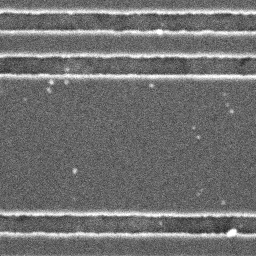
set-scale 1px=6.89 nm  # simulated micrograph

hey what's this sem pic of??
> lines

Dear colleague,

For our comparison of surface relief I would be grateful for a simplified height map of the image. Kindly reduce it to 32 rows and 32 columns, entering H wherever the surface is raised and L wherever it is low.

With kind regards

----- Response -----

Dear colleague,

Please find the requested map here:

HHHHHHHHHHHHHHHHHHHHHHHHHHHHHHHH
HHHHHHHHHHHHHHHHHHHHHHHHHHHHHHHH
LLLLLLLLLLLLLLLLLLLLLLLLLLLLLLLL
LLLLLLLLLLLLLLLLLLLLLLLLLLLLLLLL
HHHHHHHHHHHHHHHHHHHHHHHHHHHHHHHH
HHHHHHHHHHHHHHHHHHHHHHHHHHHHHHHH
HHHHHHHHHHHHHHHHHHHHHHHHHHHHHHHH
LLLLLLLLLLLLLLLLLLLLLLLLLLLLLLLL
LLLLLLLLLLLLLLLLLLLLLLLLLLLLLLLL
HHHHHHHHHHHHHHHHHHHHHHHHHHHHHHHH
HHHHHHHHHHHHHHHHHHHHHHHHHHHHHHHH
HHHHHHHHHHHHHHHHHHHHHHHHHHHHHHHH
HHHHHHHHHHHHHHHHHHHHHHHHHHHHHHHH
HHHHHHHHHHHHHHHHHHHHHHHHHHHHHHHH
HHHHHHHHHHHHHHHHHHHHHHHHHHHHHHHH
HHHHHHHHHHHHHHHHHHHHHHHHHHHHHHHH
HHHHHHHHHHHHHHHHHHHHHHHHHHHHHHHH
HHHHHHHHHHHHHHHHHHHHHHHHHHHHHHHH
HHHHHHHHHHHHHHHHHHHHHHHHHHHHHHHH
HHHHHHHHHHHHHHHHHHHHHHHHHHHHHHHH
HHHHHHHHHHHHHHHHHHHHHHHHHHHHHHHH
HHHHHHHHHHHHHHHHHHHHHHHHHHHHHHHH
HHHHHHHHHHHHHHHHHHHHHHHHHHHHHHHH
HHHHHHHHHHHHHHHHHHHHHHHHHHHHHHHH
HHHHHHHHHHHHHHHHHHHHHHHHHHHHHHHH
HHHHHHHHHHHHHHHHHHHHHHHHHHHHHHHH
HHHHHHHHHHHHHHHHHHHHHHHHHHHHHHHH
LLLLLLLLLLLLLLLLLLLLLLLLLLLLLLLL
LLLLLLLLLLLLLLLLLLLLLLLLLLLLLLLL
HHHHHHHHHHHHHHHHHHHHHHHHHHHHHHHH
HHHHHHHHHHHHHHHHHHHHHHHHHHHHHHHH
HHHHHHHHHHHHHHHHHHHHHHHHHHHHHHHH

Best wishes